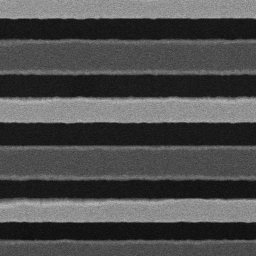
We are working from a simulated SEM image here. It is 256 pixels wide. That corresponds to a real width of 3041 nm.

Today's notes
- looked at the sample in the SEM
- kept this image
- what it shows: lines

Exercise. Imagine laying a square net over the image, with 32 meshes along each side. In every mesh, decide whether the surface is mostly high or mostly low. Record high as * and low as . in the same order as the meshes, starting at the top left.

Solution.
********************************
********************************
................................
................................
................................
********************************
********************************
********************************
********************************
................................
................................
................................
********************************
********************************
********************************
................................
................................
................................
********************************
********************************
********************************
********************************
.***.***.**..***..**.**.*.******
................................
................................
********************************
********************************
********************************
................................
................................
********************************
********************************